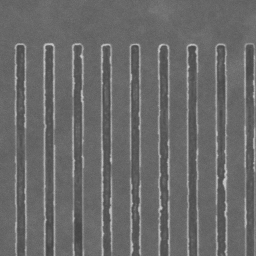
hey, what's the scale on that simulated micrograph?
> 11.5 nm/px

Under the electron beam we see parallel lines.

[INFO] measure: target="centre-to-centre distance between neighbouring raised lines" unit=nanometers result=330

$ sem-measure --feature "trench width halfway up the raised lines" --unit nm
97.9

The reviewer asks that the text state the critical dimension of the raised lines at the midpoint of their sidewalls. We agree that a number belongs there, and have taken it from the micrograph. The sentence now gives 235 nm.